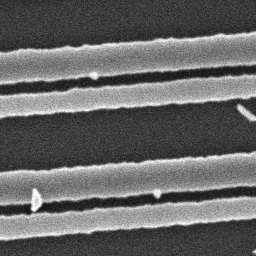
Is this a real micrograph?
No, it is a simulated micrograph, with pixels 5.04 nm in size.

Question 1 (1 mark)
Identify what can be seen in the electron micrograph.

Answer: lines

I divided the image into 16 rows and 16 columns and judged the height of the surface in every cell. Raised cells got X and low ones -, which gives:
----------------
----------------
----------XXXXXX
XXXXXXXXXXXXXXXX
XXXXXXXXXXXXXXXX
XXXXXXXXXXXXXXXX
XXXXXXXXXX------
----------------
----------------
----------------
----XXXXXXXXXXXX
XXXXXXXXXXXXXXXX
XXXXXXXXXXXXXXXX
XXXXXXXXXXXXXXXX
XXXXX-----------
----------------